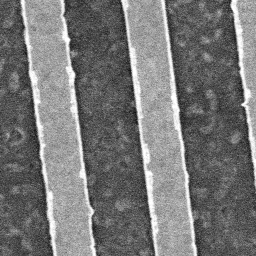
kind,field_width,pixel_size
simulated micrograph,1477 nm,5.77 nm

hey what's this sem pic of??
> one or a few lines or trenches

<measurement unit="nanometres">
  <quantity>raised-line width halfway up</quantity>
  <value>224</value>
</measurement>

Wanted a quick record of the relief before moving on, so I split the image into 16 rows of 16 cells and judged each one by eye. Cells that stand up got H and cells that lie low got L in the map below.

LHHHLLLLHHLLLLLH
LLHHLLLLHHLLLLLH
LLHHLLLLHHLLLLLH
LLHHLLLLHHHLLLLH
LLHHHLLLHHHLLLLH
LLHHHLLLHHHLLLLH
LLHHHLLLLHHLLLLH
LLHHHLLLLHHLLLLL
LLHHHLLLLHHLLLLL
LLLHHLLLLHHLLLLL
LLLHHLLLLHHHLLLL
LLLHHLLLLHHHLLLL
LLLHHLLLLHHHLLLL
LLLHHHLLLHHHLLLL
LLLHHHLLLLHHLLLL
LLLHHHLLLLHHLLLL